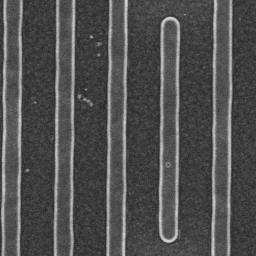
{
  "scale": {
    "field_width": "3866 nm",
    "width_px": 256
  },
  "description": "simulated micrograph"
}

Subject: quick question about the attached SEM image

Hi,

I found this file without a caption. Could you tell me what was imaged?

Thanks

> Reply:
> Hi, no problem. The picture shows groups of lines, slits or small figures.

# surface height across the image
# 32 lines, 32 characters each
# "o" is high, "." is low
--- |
.oo....oo.....oo...........oo...
.oo....oo.....oo...........oo...
.oo....oo.....oo.....o.....oo...
.oo....oo.....oo....oo.....oo...
.oo....oo.....oo....oo.....oo...
.oo....oo.....oo....oo.....oo...
.oo....oo.....oo....oo.....oo...
.oo....oo.....oo....oo.....oo...
.oo....oo.....oo....oo.....oo...
.oo....oo.....oo....oo.....oo...
.oo....oo.....oo....oo.....oo...
.oo....oo.....oo....oo.....oo...
.oo....oo.....oo....oo.....oo...
.oo....oo.....oo....oo.....oo...
.oo....oo.....oo....oo.....oo...
.oo....oo.....oo....oo.....oo...
.oo....oo.....oo....oo.....oo...
.o.....oo.....oo....oo.....oo...
oo.....oo.....oo....oo.....oo...
ooo....oo.....oo....oo.....oo...
ooo....oo.....oo....oo.....oo...
oo.....oo.....oo....oo.....oo...
oo.....oo.....oo....oo.....oo...
oo.....oo.....oo....oo.....oo...
oo.....oo.....oo....oo.....oo...
oo.....oo.....oo....oo.....oo...
oo.....oo.....oo....oo.....oo...
oo.....oo.....oo....oo.....oo...
oo.....oo.....oo....oo.....oo...
oo.....oo.....oo....oo.....oo...
oo.....oo.....oo...........oo...
oo.....oo....ooo...........oo...